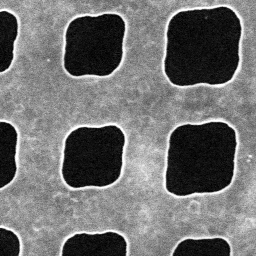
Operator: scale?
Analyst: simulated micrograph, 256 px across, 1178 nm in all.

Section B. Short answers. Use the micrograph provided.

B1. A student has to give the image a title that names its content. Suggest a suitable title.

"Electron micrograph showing holes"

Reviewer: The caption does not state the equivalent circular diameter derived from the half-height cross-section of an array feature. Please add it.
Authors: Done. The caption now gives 328 nm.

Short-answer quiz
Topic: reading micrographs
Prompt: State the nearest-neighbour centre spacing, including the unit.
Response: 496 nm